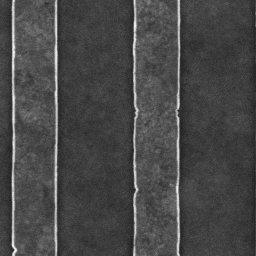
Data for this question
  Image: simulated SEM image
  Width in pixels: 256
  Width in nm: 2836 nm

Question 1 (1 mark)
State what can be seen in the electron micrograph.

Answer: one or a few lines or trenches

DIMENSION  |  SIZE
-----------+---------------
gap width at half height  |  859 nanometers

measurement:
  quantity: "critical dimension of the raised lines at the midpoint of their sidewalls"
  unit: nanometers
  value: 486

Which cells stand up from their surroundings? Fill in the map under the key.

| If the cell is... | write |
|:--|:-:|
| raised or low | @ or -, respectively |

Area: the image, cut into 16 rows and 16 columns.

-@@@----@@@-----
-@@-----@@@-----
-@@@----@@@-----
-@@@----@@@-----
-@@@----@@@-----
-@@@----@@@-----
-@@@----@@@-----
-@@@----@@@-----
-@@@----@@@-----
-@@@----@@@-----
-@@@----@@@-----
-@@@----@@@-----
-@@-----@@@-----
-@@@----@@@-----
-@@@----@@@-----
-@@@----@@@-----